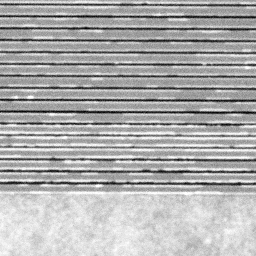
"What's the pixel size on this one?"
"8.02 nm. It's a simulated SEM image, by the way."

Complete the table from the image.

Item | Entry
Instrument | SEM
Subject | parallel lines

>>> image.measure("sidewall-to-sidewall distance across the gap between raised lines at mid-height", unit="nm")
22.1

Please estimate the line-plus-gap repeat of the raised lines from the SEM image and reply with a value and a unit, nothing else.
0.0954 um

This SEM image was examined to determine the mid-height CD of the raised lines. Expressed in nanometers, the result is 73.2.